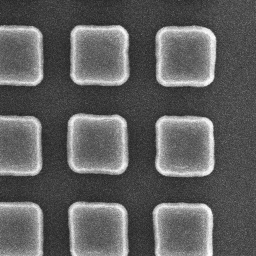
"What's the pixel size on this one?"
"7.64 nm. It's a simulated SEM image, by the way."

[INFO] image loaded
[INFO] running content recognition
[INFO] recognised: raised bodies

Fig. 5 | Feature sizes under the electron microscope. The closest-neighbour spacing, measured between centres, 661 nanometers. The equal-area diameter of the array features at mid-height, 0.474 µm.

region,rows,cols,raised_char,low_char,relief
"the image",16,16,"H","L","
LLLLLLLLLLLLLLLL
LLLLLLLLLLLLLLLL
HHHLLHHHLLHHHLLL
HHHLLHHHLLHHHLLL
HHHLLHHHLLHHHLLL
LLLLLLLLLLLLLLLL
LLLLLLLLLLLLLLLL
HHLLLHHHLLHHHLLL
HHLLHHHHLLHHHLLL
HHLLHHHHLLHHHLLL
HHLLLHHHLLHHHLLL
LLLLLLLLLLLLLLLL
LLLLLLLLLLLLLLLL
HHHLHHHHLLHHHLLL
HHHLHHHHLLHHHLLL
HHHLHHHHLLHHHLLL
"